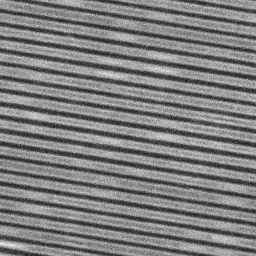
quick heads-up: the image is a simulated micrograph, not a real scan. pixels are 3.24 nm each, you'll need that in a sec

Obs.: parallel lines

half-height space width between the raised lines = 16.8 nanometers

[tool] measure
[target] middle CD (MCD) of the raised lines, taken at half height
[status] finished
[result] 25.1 nm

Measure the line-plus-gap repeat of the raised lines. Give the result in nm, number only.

42.5